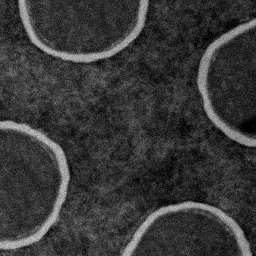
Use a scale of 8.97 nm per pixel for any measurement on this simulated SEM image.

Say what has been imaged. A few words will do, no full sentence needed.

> raised bodies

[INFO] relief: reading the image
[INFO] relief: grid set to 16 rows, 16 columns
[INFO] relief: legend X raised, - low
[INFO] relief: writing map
-XXXXXXXX-------
--XXXXXXX-------
--XXXXXX------XX
----XX-------XXX
-------------XXX
-------------XXX
-------------XXX
-------------XXX
XX-------------X
XXXX------------
XXXX------------
XXXX------------
XXXX------------
XXX-------XXXX--
XXX------XXXXXX-
--------XXXXXXX-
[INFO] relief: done